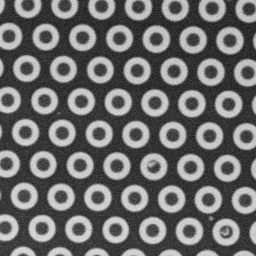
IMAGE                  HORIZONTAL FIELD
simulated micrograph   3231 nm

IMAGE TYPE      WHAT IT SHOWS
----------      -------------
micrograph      an array of small figures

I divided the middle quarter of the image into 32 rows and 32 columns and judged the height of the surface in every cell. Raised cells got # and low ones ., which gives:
###...######...######...#######.
###...######...#######..#######.
###...######...######...#######.
##.....#####....#####....#####..
........##.......###.....####...
................................
...###......###.......#.........
..#####....#####....#####.....##
.######...#######...######...###
.#######..#######..#######...###
.######...#######..#######...###
..#####....#####....######...###
...##.......###......####.....##
................................
#......###.......##.............
##....#####....######....#####..
###...######...######...######..
###...######...######...######..
###...######...######...######..
##....#####....######...######..
.......###......####.....####...
................................
...###......###.......#.........
.######....#####....#####....###
.######...######...#######...###
.######...######...#######..####
.######...######...#######..####
..#####....#####....#####....###
...##.......###......###......##
................................
#......###.......##.............
##....#####....#####.....####...